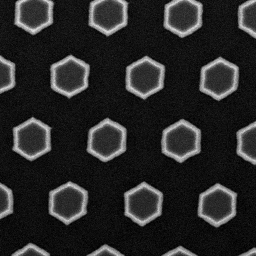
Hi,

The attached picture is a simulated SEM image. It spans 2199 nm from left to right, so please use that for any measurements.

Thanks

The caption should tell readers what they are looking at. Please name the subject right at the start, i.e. a regular array of raised bodies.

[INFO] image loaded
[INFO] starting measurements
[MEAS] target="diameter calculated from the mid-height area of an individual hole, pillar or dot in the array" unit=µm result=0.314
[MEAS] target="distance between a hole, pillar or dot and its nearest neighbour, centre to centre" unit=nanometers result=628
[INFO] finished